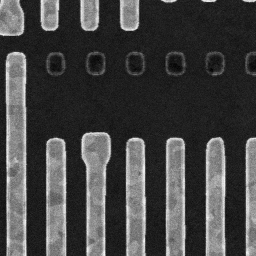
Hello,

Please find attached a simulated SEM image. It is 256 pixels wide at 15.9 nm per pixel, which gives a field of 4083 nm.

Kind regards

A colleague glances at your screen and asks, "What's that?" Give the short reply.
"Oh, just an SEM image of wiring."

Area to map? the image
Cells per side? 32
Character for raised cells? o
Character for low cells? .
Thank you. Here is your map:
oo...oo...oo...oo...............
ooo..oo...oo...oo...............
ooo..oo...oo...oo...............
ooo...o....o....o...............
................................
................................
................................
.oo...oo...oo...oo...oo...oo...o
.oo...oo...oo...oo...oo...oo...o
.oo.............................
.oo.............................
.oo.............................
.oo.............................
.oo.............................
.oo.............................
.oo.............................
.oo.............................
.oo...oo..oooo..o....oo...oo...o
.oo...oo..oooo..oo...oo...oo...o
.oo...oo..oooo..oo...oo...oo...o
.oo...oo...oo...oo...oo...oo...o
.oo...oo...oo...oo...oo...oo...o
.oo...oo...oo...oo...oo...oo...o
.oo...oo...oo...oo...oo...oo...o
.oo...oo...oo...oo...oo...oo...o
.oo...oo...oo...oo...oo...oo...o
.oo...oo...oo...oo...oo...oo...o
.oo...oo...oo...oo...oo...oo...o
.oo...oo...oo...oo...oo...oo...o
.oo...oo...oo...oo...oo...oo...o
.oo...oo...oo...oo...oo...oo...o
.oo...oo...oo...oo...oo...oo...o